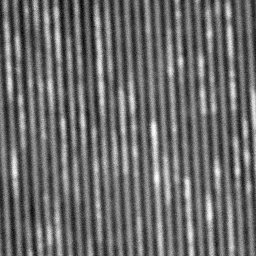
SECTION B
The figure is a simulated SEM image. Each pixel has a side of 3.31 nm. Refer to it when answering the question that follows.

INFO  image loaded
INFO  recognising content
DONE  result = parallel lines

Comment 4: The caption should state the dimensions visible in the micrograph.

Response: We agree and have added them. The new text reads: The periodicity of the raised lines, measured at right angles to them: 33.5 nm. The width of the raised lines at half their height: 14.1 nanometers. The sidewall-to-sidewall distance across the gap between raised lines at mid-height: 0.0194 microns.